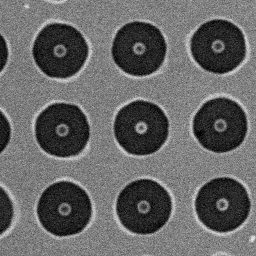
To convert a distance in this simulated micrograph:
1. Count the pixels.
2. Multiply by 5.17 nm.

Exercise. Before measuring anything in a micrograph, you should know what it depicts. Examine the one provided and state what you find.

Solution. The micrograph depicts an array of small figures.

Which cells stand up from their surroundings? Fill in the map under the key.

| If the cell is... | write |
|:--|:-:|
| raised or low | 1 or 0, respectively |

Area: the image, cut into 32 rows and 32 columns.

11111111111111111111111111111111
11111111111111111111111111111111
11111111111111111111111111001111
11111000011111100000111110000011
11110000001111000000111100000001
01110000000111000000011000010001
01110001000111000100011100000001
01110000000111000000011100000001
01111000001111100000111110000011
11111100011111110011111111111111
11111111111111111111111111111111
11111111111111111111111111111111
11111111111111111011111111000111
11111100001111100000111110000011
01111000000111000000011100000001
01110000000111000100011100010001
01110001000111000000011100000001
01110000000111000000011110000011
01111000000111100000111111000011
11111110001111111111111111111111
11111111111111111111111111111111
11111111111111111111111111111111
11111111011111111001111111000011
01111100001111100000011110000001
01111000000111100000011100000001
00111000000111000100001100010001
00111000100011000000001100000001
00111000000111100000011110000001
01111000000111100000111111000011
11111110011111111111111111111111
11111111111111111111111111111111
11111111111111111111111111111111